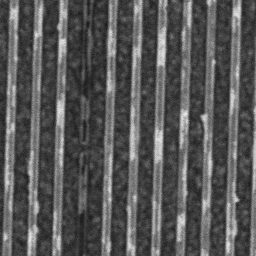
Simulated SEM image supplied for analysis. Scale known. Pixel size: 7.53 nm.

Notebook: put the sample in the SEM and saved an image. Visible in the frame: parallel lines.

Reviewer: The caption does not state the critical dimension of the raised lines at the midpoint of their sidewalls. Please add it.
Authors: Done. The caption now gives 52.7 nanometres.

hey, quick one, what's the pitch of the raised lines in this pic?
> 186 nm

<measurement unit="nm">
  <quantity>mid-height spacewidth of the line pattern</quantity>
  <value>135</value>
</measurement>